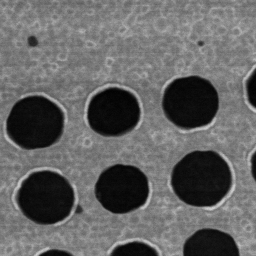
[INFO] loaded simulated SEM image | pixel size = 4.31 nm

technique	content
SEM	holes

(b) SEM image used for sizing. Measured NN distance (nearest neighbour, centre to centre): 331 nm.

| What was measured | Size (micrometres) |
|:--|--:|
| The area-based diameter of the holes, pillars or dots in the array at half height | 0.235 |